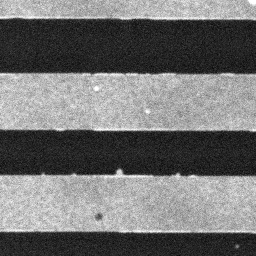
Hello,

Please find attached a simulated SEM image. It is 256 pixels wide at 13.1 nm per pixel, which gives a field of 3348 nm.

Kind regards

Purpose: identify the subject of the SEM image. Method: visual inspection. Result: lines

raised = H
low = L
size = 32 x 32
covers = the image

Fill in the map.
HHHHHHHHHHHHHHHHHHHHHHHHHHHHHHHH
HHHHHHHHHHHHHHHHHHHHHHHHHHHHHHHH
LLLLLLLLLLLLLLLLLLLLLLLLLLLLLLLL
LLLLLLLLLLLLLLLLLLLLLLLLLLLLLLLL
LLLLLLLLLLLLLLLLLLLLLLLLLLLLLLLL
LLLLLLLLLLLLLLLLLLLLLLLLLLLLLLLL
LLLLLLLLLLLLLLLLLLLLLLLLLLLLLLLL
LLLLLLLLLLLLLLLLLLLLLLLLLLLLLLLL
LLLLLLLLLLLLLLLLLLLLLLLLLLLLLLLL
HHHHHHHHHHHHHHHHHHHHHHHHHHHHHHHH
HHHHHHHHHHHHHHHHHHHHHHHHHHHHHHHH
HHHHHHHHHHHHHHHHHHHHHHHHHHHHHHHH
HHHHHHHHHHHHHHHHHHHHHHHHHHHHHHHH
HHHHHHHHHHHHHHHHHHHHHHHHHHHHHHHH
HHHHHHHHHHHHHHHHHHHHHHHHHHHHHHHH
HHHHHHHHHHHHHHHHHHHHHHHHHHHHHHHH
LLLLLLLLLLLLLLLLLLLLLLLLLLLLLLLL
LLLLLLLLLLLLLLLLLLLLLLLLLLLLLLLL
LLLLLLLLLLLLLLLLLLLLLLLLLLLLLLLL
LLLLLLLLLLLLLLLLLLLLLLLLLLLLLLLL
LLLLLLLLLLLLLLLLLLLLLLLLLLLLLLLL
LLLLLLLLLLLLLLLLLLLLLLLLLLLLLLLL
HHHHHHHHHHHHHHHHHHHHHHHHHHHHHHHH
HHHHHHHHHHHHHHHHHHHHHHHHHHHHHHHH
HHHHHHHHHHHHHHHHHHHHHHHHHHHHHHHH
HHHHHHHHHHHHHHHHHHHHHHHHHHHHHHHH
HHHHHHHHHHHHHHHHHHHHHHHHHHHHHHHH
HHHHHHHHHHHHHHHHHHHHHHHHHHHHHHHH
HHHHHHHHHHHHHHHHHHHHHHHHHHHHHHHH
LLLLLLLLLLLLLLLLLLLLLLLLLLLLLLLL
LLLLLLLLLLLLLLLLLLLLLLLLLLLLLLLL
LLLLLLLLLLLLLLLLLLLLLLLLLLLLLLLL